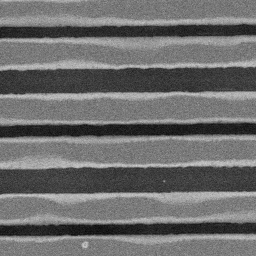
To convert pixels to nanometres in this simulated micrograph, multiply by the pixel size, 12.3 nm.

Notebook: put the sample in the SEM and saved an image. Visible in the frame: lines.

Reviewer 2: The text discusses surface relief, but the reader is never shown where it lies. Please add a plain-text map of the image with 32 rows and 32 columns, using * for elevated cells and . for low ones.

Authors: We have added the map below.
********************************
********************************
********************************
................................
................................
********************************
********************************
********************************
****..........*.................
................................
................................
................................
********************************
********************************
********************************
................................
................................
********************************
********************************
********************************
********************************
................................
................................
................................
*******...***********...********
********************************
********************************
******************************..
................................
........................********
********************************
********************************